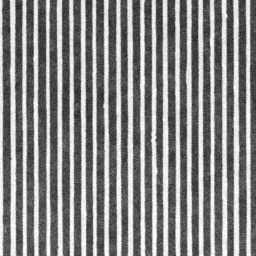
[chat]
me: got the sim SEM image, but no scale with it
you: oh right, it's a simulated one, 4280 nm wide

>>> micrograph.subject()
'parallel lines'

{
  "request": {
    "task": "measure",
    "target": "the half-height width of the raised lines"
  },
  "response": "56.4 nanometers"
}